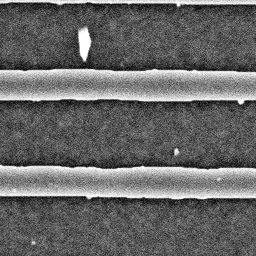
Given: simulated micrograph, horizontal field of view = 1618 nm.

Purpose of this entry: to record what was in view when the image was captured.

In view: lines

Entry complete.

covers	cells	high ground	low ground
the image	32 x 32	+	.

......................+.........
................................
................................
................................
..........+.....................
..........+.....................
..........+.....................
................................
................................
++++++++++++++++++++++++++++++++
++++++++++++++++++++++++++++++++
++++++++++++++++++++++++++++++++
....+............+++++++.....++.
................................
................................
................................
................................
................................
................................
................................
................................
++++++++++++++++++++++++++++++++
++++++++++++++++++++++++++++++++
++++++++++++++++++++++++++++++++
..........++++++++++++++++++++++
................................
................................
................................
................................
................................
................................
................................